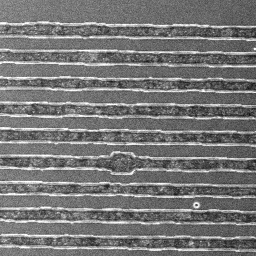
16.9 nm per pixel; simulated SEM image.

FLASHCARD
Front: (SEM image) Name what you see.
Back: wiring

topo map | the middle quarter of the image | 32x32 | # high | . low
................................
................................
................................
######..........................
################################
################################
..................##############
................................
................................
................................
################################
################################
################################
................................
................................
................................
####......######................
################################
################################
################################
................................
................................
............#####...............
################################
################################
################################
...........#######.........#####
............###.................
................................
................................
################################
################################